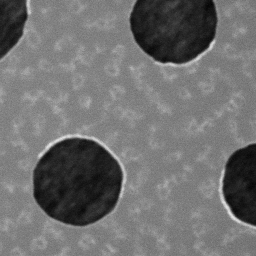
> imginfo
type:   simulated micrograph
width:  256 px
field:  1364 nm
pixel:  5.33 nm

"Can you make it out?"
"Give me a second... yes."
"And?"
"holes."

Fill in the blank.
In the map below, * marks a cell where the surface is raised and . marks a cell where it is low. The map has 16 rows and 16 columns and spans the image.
..******.....***
..******......**
.*******.....***
*********...****
****************
****************
****************
****************
****************
***....********.
**......******..
**......******..
**.....*******..
***....********.
****************
****************